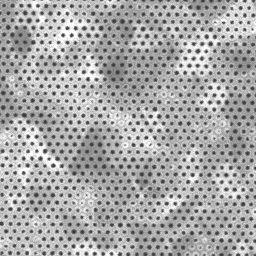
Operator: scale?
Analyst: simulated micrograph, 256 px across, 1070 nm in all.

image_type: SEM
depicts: a regular array of holes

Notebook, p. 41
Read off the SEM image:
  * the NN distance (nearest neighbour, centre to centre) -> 8.04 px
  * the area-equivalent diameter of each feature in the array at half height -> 17.6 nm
